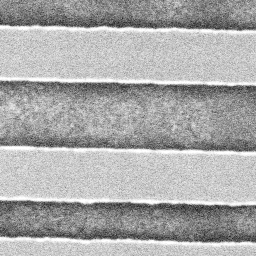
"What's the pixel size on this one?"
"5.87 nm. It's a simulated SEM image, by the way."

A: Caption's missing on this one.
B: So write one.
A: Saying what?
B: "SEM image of lines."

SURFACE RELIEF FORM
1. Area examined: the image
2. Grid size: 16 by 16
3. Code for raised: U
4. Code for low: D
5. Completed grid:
DDDDDDDDDDDDDDDD
DDDDDDDDDDDDDDDD
UUUUUUUUUUUUUUUU
UUUUUUUUUUUUUUUU
UUUUUUUUUUUUUUUU
DDDDDDDDDDDDDDDD
DDDDDDDDDDDDDDDD
DDDDDDDDDDDDDDDD
DDDDDDDDDDDDDDDD
UUUUUUUUUUUUUDDD
UUUUUUUUUUUUUUUU
UUUUUUUUUUUUUUUU
DDUUUUUUUUUUUUUU
DDDDDDDDDDDDDDDD
DDDDDDDDDDDDDDDD
UUUUUUUUUUUUUUUU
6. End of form